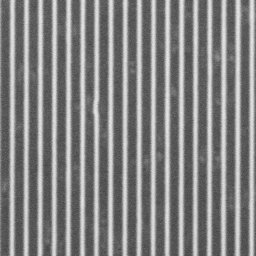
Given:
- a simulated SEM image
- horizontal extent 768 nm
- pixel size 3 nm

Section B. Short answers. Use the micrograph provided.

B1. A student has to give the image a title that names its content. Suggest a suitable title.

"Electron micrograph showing parallel lines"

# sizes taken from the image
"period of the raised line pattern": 42.3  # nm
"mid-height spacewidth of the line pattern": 32.7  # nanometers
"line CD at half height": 8.3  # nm